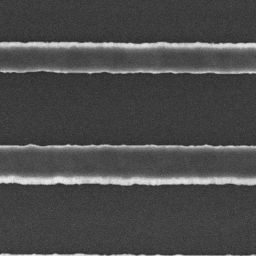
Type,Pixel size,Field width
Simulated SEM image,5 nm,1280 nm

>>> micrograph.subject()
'lines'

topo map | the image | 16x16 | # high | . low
................
................
................
################
##.#############
................
................
................
................
################
################
................
................
................
................
................